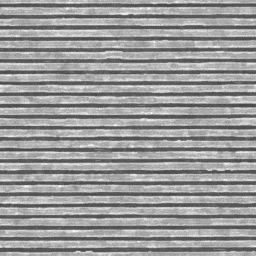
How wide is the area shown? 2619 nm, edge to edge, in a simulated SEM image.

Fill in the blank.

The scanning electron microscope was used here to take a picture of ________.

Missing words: parallel lines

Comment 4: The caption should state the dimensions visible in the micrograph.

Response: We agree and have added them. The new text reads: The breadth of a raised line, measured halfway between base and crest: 6.37 pixels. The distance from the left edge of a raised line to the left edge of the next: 0.114 microns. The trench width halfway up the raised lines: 46 nm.